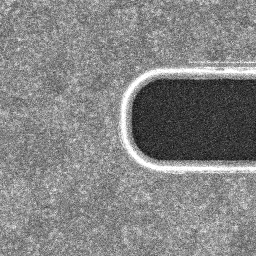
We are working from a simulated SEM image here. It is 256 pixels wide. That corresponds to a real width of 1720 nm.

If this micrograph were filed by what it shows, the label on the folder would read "one or a few lines or trenches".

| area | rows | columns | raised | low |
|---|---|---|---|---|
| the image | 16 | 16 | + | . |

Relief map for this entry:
++++++++++++++++
++++++++++++++++
++++++++++++++++
++++++++++++++++
++++++++++......
++++++++........
++++++++........
++++++++........
++++++++........
++++++++........
++++++++++......
++++++++++++++++
++++++++++++++++
++++++++++++++++
++++++++++++++++
++++++++++++++++